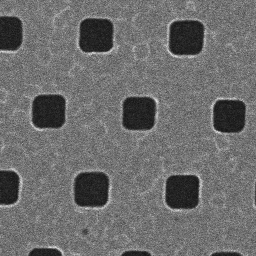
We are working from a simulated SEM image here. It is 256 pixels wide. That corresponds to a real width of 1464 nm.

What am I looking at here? holes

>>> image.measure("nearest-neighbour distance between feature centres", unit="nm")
509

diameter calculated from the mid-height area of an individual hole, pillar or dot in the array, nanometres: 207